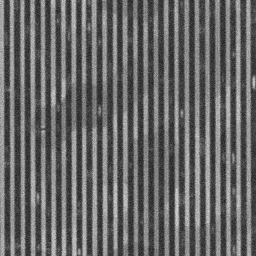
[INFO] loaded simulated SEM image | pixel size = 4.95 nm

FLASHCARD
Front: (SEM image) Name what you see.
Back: parallel lines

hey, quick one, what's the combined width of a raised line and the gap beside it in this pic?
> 50.9 nanometers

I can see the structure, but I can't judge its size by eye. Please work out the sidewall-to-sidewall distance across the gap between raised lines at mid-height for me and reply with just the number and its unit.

34.1 nanometers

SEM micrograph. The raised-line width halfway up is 14.2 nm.